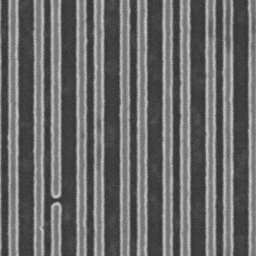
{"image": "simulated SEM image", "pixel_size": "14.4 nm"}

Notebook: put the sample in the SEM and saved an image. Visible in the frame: parallel lines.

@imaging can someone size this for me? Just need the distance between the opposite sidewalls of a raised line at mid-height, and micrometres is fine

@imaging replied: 0.113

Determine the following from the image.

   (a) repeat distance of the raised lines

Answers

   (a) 309 nm